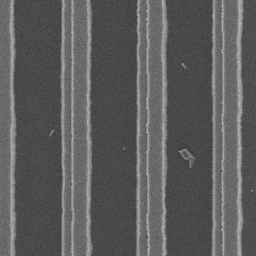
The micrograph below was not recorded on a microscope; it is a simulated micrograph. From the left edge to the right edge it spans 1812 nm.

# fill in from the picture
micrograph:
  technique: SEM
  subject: lines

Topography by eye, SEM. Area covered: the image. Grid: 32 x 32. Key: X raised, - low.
XX------XXX------XXX-------XXX--
XX------XXX------XXXX------XXX--
X-------XXX------XXXX------XXX--
X-------XXX------XXXX------XXX--
XX------XXX------XXXX------XXX--
XX------XXX------XXX-------XXX--
XX------XXX------XXX-------XXX--
XX------XXX------XXX-------XXX--
XX------XXX------XXXX------XXX--
XX------XXX------XXX-------XXX--
X-------XXX------XXXX------XXX--
XX------XXX------XXX-------XXX--
XX------XXX------XXXX------XXX--
XX------XXX------XXXX------XXX--
XX------XXX------XXX-------XXX--
XX------XXX------XXX-------XXX--
X-------XXX------XXXX------XXX--
X-------XXX------XXX-------XXX--
XX------XXX------XXX-------XXX--
XX------XXX------XXX-------XXX--
XX------XXX------XXX-------XXX--
X-------XXX------XXX-------XXX--
XX------XXX------XXX-------XXX--
XX------XXX------XXX-------XXX--
XX------XXX------XXXX------XXX--
XX------XXX------XXXX------XXX--
X-------XXX------XXXX------XXX--
XX------XXX------XXX-------XXX--
XX------XXX------XXX-------XXX--
XX------XXX------XXXX------XXX--
X-------XXX------XXXX------XXX--
XX------XXX------XXXX------XXX--